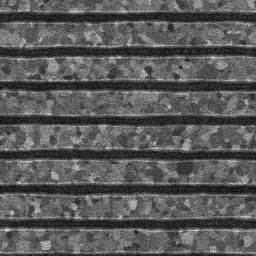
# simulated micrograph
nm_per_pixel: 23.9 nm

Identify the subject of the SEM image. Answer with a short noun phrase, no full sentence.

parallel lines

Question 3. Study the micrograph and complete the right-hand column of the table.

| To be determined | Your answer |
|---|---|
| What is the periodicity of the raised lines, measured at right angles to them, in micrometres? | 0.824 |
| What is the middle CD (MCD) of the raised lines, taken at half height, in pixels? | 23.9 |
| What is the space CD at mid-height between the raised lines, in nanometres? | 245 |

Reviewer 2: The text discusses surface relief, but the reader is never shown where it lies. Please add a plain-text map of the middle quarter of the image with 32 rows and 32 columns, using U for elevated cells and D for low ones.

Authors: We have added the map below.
UUUUUUUUUUUUUUUUUUUUUUUUUUUUUUUU
UUUUUUUUUUUUUUUUUUUUUUUUUUUUUUUU
UUUUUUUUUUUUUUUUUUUUUUUUUUUUUUUU
UUUUUUUUUUUUUUUUUUUUUUUUUUUUUUUU
DDDDDDDDDDDDDDDDDDDDDDDDDDDDDDDD
DDDDDDDDDDDDDDDDDDDDDDDDDDDDDDDD
DDDDDDDDDDDDDDDDDDDDDDDDDDDDDDDD
UUUUUUUUUUUUUUUUUUUUUUUUUUUUUUUU
UUUUUUUUUUUUUUUUUUUUUUUUUUUUUUUU
UUUUUUUUUUUUUUUUUUUUUUUUUUUUUUUU
UUUUUUUUUUUUUUUUUUUUUUUUUUUUUUUU
UUUUUUUUUUUUUUUUUUUUUUUUUUUUUUUU
UUUUUUUUUUUUUUUUUUUUUUUUUUUUUUUU
DDDDDDDDDDDDDDDDDDDDDDDDDDDDDDDD
DDDDDDDDDDDDDDDDDDDDDDDDDDDDDDDD
DDDDDDDDUUUUDDDDDDDDDDDDDDDDDDDD
UUUUUUUUUUUUUUUUUUUUUUUUUUUUUUUU
UUUUUUUUUUUUUUUUUUUUUUUUUUUUUUUU
UUUUUUUUUUUUUUUUUUUUUUUUUUUUUUUU
UUUUUUUUUUUUUUUUUUUUUUUUUUUUUUUU
UUUUUUUUUUUUUUUUUUUUUUUUUUUUUUUU
DDDDDDDDDDDDDDDDDDDDDDDDDDDDDUUU
DDDDDDDDDDDDDDDDDDDDDDDDDDDDDDDD
DDDDDDDDDDDDDDDDDDDDDDDDDDDDDDDD
UUUUUUUUUUUUUUUUUUUUUUUUUDDDUUUU
UUUUUUUUUUUUUUUUUUUUUUUUUUUUUUUU
UUUUUUUUUUUUUUUUUUUUUUUUUUUUUUUU
UUUUUUUUUUUUUUUUUUUUUUUUUUUUUUUU
UUUUUUUUUUUUUUUUUUUUUUUUUUUUUUUU
UUUUUUUUUUUUUUUUUUUUUUUUUUUUUUUU
DDDDDDDDDDDDDDDDDDDDDDDDDDDDDDDD
DDDDDDDDDDDDDDDDDDDDDDDDDDDDDDDD